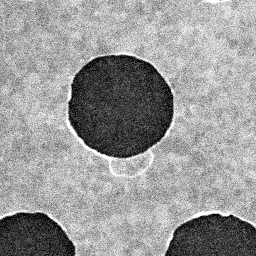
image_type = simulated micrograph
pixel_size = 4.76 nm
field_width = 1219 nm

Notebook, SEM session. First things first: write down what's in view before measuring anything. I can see holes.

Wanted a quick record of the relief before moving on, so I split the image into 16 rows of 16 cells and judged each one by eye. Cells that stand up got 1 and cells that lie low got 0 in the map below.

1111111111111111
1111111111111111
1111111111111111
1111111011111111
1111100000111111
1111000000011111
1111000000011111
1111000000011111
1111100000111111
1111110001111111
1111111001111111
1111111111111111
1111111111111111
0001111111110001
0000111111100000
0000011111000000